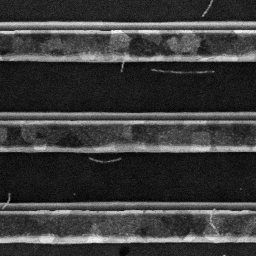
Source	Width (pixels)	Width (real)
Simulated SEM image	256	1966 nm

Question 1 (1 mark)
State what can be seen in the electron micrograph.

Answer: lines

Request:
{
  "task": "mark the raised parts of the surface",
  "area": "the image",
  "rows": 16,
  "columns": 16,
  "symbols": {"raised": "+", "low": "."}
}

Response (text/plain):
................
++++++++++++++++
++++++++++++++++
++++++++++++++++
................
................
................
++++++++++++++++
++++++++++++++++
................
................
................
................
++++++++++++++++
++++++++++++++++
................